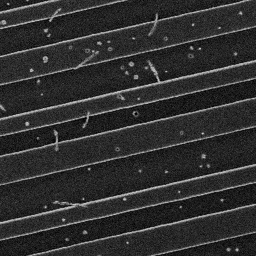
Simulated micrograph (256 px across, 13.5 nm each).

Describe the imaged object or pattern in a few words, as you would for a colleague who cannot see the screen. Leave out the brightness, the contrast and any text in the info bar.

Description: lines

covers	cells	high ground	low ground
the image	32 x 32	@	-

----@@@@@@@@@@---------------@@@
@@@@@@@@@---------------@@@@@@@@
@@@@@--------------@@@@@@@@@@@@@
----------------@@@@@@@@@@@@@@@-
-----------@@@@@@@@@@@@@@@@-----
-------@@@@@@@@@@@@@@@@---------
--@@@@@@@@@@@@@@@@--------------
@@@@@@@@@@@@@@------------------
@@@@@@@@@@------------------@@@@
@@@@@------------------@@@@@@@@@
@------------------@@@@@@@@@@---
---------------@@@@@@@@@@-------
----------@@@@@@@@@@-----------@
------@@@@@@@@@-----------@@@@@@
-@@@@@@@@@@-----------@@@@@@@@@@
@@@@@@@-----------@@@@@@@@@@@@@@
@@-----------@@@@@@@@@@@@@@@@---
---------@@@@@@@@@@@@@@@@-------
-----@@@@@@@@@@@@@@@@-----------
@@@@@@@@@@@@@@@@----------------
@@@@@@@@@@@@--------------------
@@@@@@@---------------------@@@@
@@@---------------------@@@@@@@@
-------------------@@@@@@@@@@---
---------------@@@@@@@@@@-------
----------@@@@@@@@@@------------
------@@@@@@@@@@------------@@@@
-@@@@@@@@@@------------@@@@@@@@@
@@@@@@@------------@@@@@@@@@@@@@
@@@-----------@@@@@@@@@@@@@@@@--
----------@@@@@@@@@@@@@@@-------
------@@@@@@@@@@@@@@@-----------